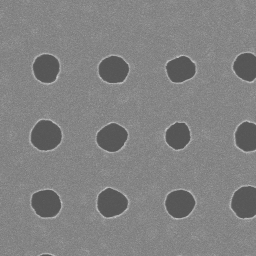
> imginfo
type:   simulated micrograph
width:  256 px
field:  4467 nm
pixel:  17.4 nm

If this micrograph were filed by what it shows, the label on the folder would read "a regular array of holes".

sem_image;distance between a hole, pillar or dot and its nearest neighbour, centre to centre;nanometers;1150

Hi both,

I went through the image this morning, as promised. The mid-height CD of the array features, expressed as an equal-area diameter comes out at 505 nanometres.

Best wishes